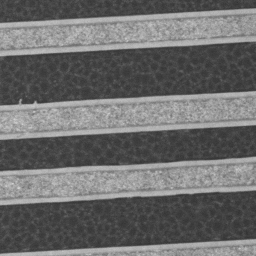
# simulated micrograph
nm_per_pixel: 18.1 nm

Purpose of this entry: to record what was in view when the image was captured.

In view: one or a few lines or trenches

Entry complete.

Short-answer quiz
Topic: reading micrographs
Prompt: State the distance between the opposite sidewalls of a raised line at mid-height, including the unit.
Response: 523 nm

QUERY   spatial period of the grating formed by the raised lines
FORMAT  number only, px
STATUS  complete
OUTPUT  74.1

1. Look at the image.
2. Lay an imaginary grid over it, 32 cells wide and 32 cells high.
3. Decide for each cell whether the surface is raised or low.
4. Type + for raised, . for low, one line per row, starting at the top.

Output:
................................
..............................++
.............+++++++++++++++++++
++++++++++++++++++++++++++++++++
++++++++++++++++++++++++++++++++
++++++++++++++++++++++..........
+++++...........................
................................
................................
................................
................................
................................
.................+++++++++++++++
++++++++++++++++++++++++++++++++
++++++++++++++++++++++++++++++++
++++++++++++++++++++++++++++....
+++++++++++.....................
................................
................................
................................
......................++++++++++
....++++++++++++++++++++++++++++
++++++++++++++++++++++++++++++++
++++++++++++++++++++++++++++++++
++++++++++++++..................
................................
................................
................................
................................
................................
..........................++++++
........++++++++++++++++++++++++